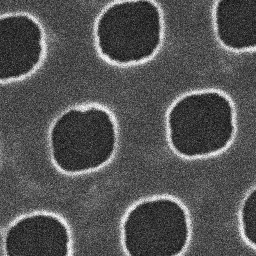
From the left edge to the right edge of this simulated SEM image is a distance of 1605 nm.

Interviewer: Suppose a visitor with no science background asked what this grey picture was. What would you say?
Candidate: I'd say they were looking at holes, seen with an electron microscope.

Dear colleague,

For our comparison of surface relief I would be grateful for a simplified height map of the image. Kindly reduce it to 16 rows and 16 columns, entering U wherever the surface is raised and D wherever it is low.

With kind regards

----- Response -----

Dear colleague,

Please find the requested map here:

UUUUUUUDDDUUUUDD
DDUUUUDDDDUUUUDD
DDDUUUDDDDUUUUDD
DDUUUUUDDUUUUUUU
DDUUUUUUUUUUUUUU
UUUUUUUUUUUUUUUU
UUUUUUUUUUUDDDUU
UUUUDDDUUUUDDDUU
UUUDDDDUUUUDDDUU
UUUDDDDUUUUDDUUU
UUUUDDUUUUUUUUUU
UUUUUUUUUUUUUUUU
UUUUUUUUUUUUUUUD
UUDUUUUUDDDDUUUD
UDDDUUUUDDDDUUUD
DDDDUUUUDDDUUUUU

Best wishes